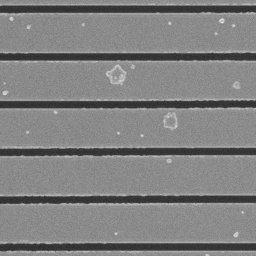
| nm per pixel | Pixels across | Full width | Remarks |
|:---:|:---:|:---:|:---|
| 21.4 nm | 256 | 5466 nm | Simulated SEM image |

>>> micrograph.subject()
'lines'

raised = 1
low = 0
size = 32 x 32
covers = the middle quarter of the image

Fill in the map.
11111111111111111111111111111111
11111111111111111111111111111111
11111111111111111111111111111111
11111111111111111111111111111111
11111111111111111111111111111111
11111111111111111111111111111111
11111111111111111111111111111111
11111111111111111111111111111111
11111111111111111111111111111111
00000000000000000000000000000000
00000000000000000000000000000000
11111111111111111111111111111111
11111111111111111111111111111111
11111111111111111111111111111111
11111111111111111111111111111111
11111111111111111111111111111111
11111111111111111111111111111111
11111111111111111111111111111111
11111111111111111111111111111111
11111111111111111111111111111111
11111111111111111111111111111111
00000000000000000000000000000000
00000000000000000000000000000000
11111111111111111111111111111111
11111111111111111111111111111111
11111111111111111111111111111111
11111111111111111111111111111111
11111111111111111111111111111111
11111111111111111111111111111111
11111111111111111111111111111111
11111111111111111111111111111111
11111111111111111111111111111111